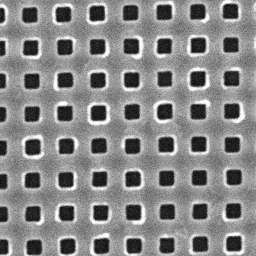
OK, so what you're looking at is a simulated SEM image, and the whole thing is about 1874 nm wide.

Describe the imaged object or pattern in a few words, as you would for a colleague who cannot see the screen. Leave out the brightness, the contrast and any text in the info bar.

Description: a regular array of holes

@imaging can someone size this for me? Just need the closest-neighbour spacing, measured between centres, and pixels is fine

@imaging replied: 32.7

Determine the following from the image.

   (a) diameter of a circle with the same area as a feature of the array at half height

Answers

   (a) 129 nm